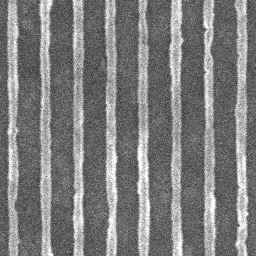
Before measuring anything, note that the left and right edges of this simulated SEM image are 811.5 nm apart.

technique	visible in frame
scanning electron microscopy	parallel lines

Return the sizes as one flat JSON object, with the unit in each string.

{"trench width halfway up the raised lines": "77.2 nm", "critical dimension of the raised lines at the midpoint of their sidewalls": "27.3 nm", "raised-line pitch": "104 nanometres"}